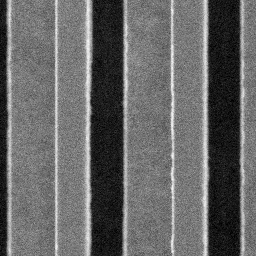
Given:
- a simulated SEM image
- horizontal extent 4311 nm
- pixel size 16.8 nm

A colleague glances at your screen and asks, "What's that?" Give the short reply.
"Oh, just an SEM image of lines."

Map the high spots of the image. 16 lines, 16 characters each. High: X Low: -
-XXXXX--XXXXX--X
-XXXXX--XXXXX--X
-XXXXX--XXXXX--X
-XXXXX--XXXXX--X
-XXXXX--XXXXX--X
-XXXXX--XXXXX--X
-XXXXX--XXXXX--X
-XXXXX--XXXXX--X
-XXXXX--XXXXX--X
-XXXXX--XXXXX--X
-XXXXX--XXXXX--X
-XXXXX--XXXXX--X
-XXXXX--XXXXX--X
-XXXXX--XXXXX--X
-XXXXX--XXXXX--X
-XXXXX--XXXXX--X